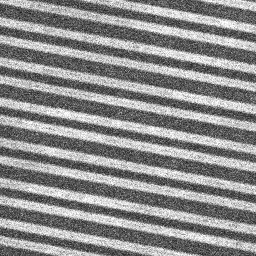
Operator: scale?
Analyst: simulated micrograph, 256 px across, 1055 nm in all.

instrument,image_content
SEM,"parallel lines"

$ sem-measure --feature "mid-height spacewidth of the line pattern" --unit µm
0.0496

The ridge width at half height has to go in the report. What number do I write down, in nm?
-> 22.7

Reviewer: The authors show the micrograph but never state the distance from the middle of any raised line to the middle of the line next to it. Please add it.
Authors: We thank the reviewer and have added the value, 81.1 nm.